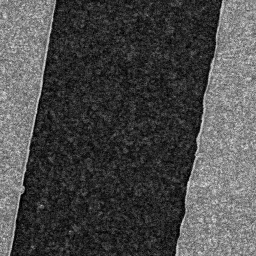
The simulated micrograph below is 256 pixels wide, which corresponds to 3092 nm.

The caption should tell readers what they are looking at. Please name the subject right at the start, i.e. one or a few lines or trenches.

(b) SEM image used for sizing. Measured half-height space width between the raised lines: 1990 nanometers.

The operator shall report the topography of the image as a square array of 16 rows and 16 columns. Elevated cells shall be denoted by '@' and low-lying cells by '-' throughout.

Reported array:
@@@-----------@@
@@@-----------@@
@@@-----------@@
@@@----------@@@
@@@----------@@@
@@@----------@@@
@@-----------@@@
@@-----------@@@
@@----------@@@@
@@----------@@@@
@@----------@@@@
@-----------@@@@
@-----------@@@@
@-----------@@@@
@----------@@@@@
@----------@@@@@